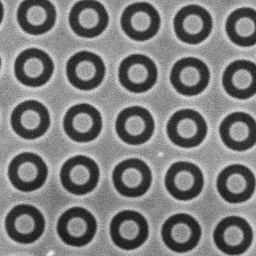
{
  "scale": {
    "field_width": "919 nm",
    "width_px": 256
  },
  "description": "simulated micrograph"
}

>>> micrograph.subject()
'an array of small figures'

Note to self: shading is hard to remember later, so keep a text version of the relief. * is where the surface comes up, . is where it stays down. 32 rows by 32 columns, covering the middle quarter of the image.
....***...****...**....****.....
...*****...**....***...****...**
*..****...***...*****...**...***
*...***...****..****....**...***
*........*****....*....****...**
**.......******.......*****.....
****...*********.....*******....
******************.**********...
********************************
********************************
**.....**********..*************
*.......*******......********...
....*....*****........*****.....
...****..****....**...****......
..*****...***...****...***...***
...****...***..*****...**....***
....**....***...****...**....***
.........****....*....****...***
**......******........****......
***...*********......******.....
****************************....
********************************
********************************
*.....**********...*************
........******......********....
.........****........******.....
..****...***....**....****......
..****...***...****...***....**.
..****...***...****...***...****
...**....***...****...***...****
........****....**....***...****
*......******........*****......